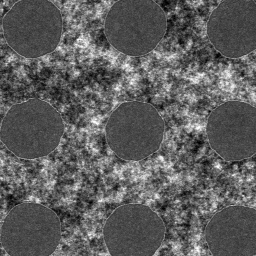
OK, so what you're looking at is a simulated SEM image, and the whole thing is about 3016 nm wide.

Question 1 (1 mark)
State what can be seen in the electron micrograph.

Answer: raised bodies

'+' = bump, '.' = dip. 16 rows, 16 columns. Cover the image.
.+++...+++...+++
++++...+++...+++
++++...+++...+++
.++.....+.....+.
................
................
.++.....+.....++
++++...+++...+++
++++...+++...+++
.++....+++....++
................
................
................
++++...+++...+++
++++..++++...+++
++++...+++...+++